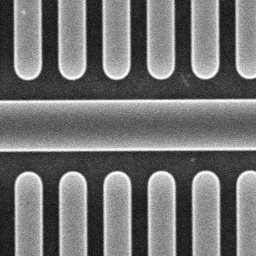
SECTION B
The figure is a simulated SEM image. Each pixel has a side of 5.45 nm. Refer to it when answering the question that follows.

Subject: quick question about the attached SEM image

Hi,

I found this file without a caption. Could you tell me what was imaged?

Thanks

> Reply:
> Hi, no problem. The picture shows groups of lines, slits or small figures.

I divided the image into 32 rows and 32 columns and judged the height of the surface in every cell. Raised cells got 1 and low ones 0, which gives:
00111001111001110011110011100011
00111001111001110011110011100011
00111001111001110011110011100011
00111001111001110011110011100011
00111001111001110011110011100011
00111001111001110011110011100011
00111001111001110011110011100011
00111001111001110011110011100011
00111001111001110001110011100011
00110000110000110001100001000011
00000000000000000000000000000000
00000000000000000000000000000000
00000000000000000000000000000000
11111111111111111111111111111111
11111111111111111111111111111111
11111111111111111111111111111111
11111111111111111111111111111111
11111111111111111111111111111111
11111111111111111111111111111111
00000000000000000000000000000000
00000000000000000000000000000000
00000000000000000000000000000000
00111000110001110001110011100011
00111000111001110001110011100011
00111000111001110001110011100011
00111000111001110001110011100011
00111000111001110001110011100011
00111000111001110001110011100011
00111000111001110001110011100011
00111000111001110001110011100011
00111000111001110001110011100011
00111000111001110001110011100011